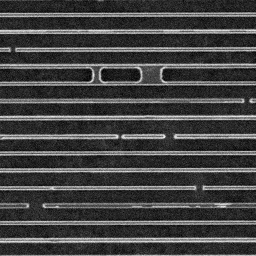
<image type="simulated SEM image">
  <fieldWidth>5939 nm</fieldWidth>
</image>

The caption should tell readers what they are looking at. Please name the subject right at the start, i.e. parallel lines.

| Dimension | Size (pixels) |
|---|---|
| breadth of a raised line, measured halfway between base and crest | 3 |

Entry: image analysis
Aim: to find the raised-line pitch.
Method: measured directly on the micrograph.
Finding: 402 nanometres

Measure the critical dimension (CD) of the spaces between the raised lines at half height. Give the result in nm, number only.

345